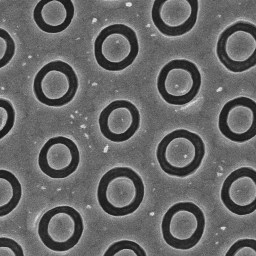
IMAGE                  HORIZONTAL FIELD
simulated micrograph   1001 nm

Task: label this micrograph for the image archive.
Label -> a regular array of ring-shaped grooves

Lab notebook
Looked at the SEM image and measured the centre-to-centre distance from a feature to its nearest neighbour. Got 274 nm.